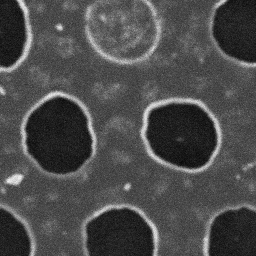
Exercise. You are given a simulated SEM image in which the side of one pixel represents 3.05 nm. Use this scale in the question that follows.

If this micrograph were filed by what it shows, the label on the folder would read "holes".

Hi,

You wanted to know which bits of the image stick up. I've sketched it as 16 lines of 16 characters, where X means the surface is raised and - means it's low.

-XXXXXXXXXXXXX--
--XXXXXXXXXXX---
--XXXXXXXXXXX---
-XXXXXXXXXXXXX--
XXXXXXXXXXXXXXXX
XXXXXXXXXXXXXXXX
XXX--XXXXX--XXXX
XX---XXXX----XXX
XX----XXX-----XX
XX----XXXX---XXX
XXX--XXXXXXXXXXX
XXXXXXXXXXXXXXXX
XXXXXXXXXXXXXXXX
-XXXXX---XXXXX--
--XXX-----XXX---
--XXX-----XXX---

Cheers